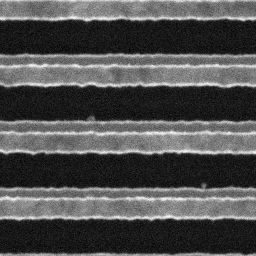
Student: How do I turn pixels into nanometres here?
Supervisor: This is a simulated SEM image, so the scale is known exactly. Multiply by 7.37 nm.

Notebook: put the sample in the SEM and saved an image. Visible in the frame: lines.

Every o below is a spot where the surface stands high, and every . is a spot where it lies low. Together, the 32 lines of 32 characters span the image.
oooooooooooooooooooooooooooooooo
oooooooooooooooooooooooooooooooo
......o.......................o.
................................
................................
................................
................................
oooooooooooooooooooooooooooooooo
oooooooooooooooooooooooooooooooo
oooooooooooooooooooooooooooooooo
oooooooooooooooooooooooooooooooo
................................
................................
................................
................................
oooooooooooooooooooooooooooooooo
oooooooooooooooooooooooooooooooo
oooooooooooooooooooooooooooooooo
oooooooooooooooooooooooooooooooo
................................
................................
................................
................................
........o...o..........o....oo..
oooooooooooooooooooooooooooooooo
oooooooooooooooooooooooooooooooo
oooooooooooooooooooooooooooooooo
................................
................................
................................
................................
................................